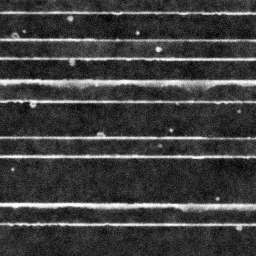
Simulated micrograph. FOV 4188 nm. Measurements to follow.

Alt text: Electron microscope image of lines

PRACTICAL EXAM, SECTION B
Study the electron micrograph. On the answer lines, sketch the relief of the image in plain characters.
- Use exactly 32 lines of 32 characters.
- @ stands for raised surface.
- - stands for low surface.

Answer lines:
@@@@@@@@@@@@@@@@@@@@@@@@@@@@@@@@
@@@@@@@@@@@@@@@@@@@@@@@@@@@@@@@@
--------------------------------
--------------------------------
--------------------------------
@@@@@@@@@@@@@@@@@@@@@@@@@@@@@@@@
@@@@@@@@@@@@@@@@@@@@@@@@@@@@@@@@
--------------------------------
--------------------------------
--------------------------------
@@@@@@@@@@@@@@@@@@@@@@@@-@@@@@@@
@@@@@@@@@@@@@@@@@@@@@@@@@@@@@@@@
@@@@@@@@@@@@@@@@@@@@@@@@@@@@@@@@
--------------------------------
--------------------------------
--------------------------------
--------------------------------
@@@@@@@@@@@@@@@@@@@@@@@@@@@@@@@@
@@@@@@@@@@@@@@@@@@@@@@@@@@@@@@@@
@@@@@@@@@@@@@@@@@@@@@@@@@@@@@@@@
--------------------------------
--------------------------------
--------------------------------
--------------------------------
--------------------------------
--------------------------------
@@@@@@@@@@@@@@@@@@@@@@@@@@@@@@@@
@@@@@@@@@@@@@@@@@@@@@@@@@@@@@@@@
--------------------------------
--------------------------------
--------------------------------
--------------------------------